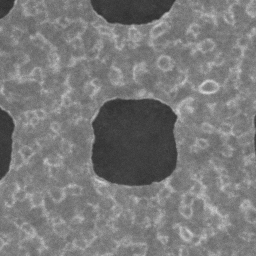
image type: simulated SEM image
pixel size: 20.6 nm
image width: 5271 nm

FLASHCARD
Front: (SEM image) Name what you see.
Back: holes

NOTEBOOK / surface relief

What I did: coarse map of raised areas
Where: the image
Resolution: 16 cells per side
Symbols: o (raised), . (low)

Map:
.ooooo.....ooooo
ooooooo..ooooooo
oooooooooooooooo
oooooooooooooooo
oooooooooooooooo
oooooooooooooooo
ooooooo...oooooo
.ooooo.....ooooo
.ooooo.....ooooo
.ooooo.....ooooo
.ooooo.....ooooo
ooooooo..ooooooo
oooooooooooooooo
oooooooooooooooo
oooooooooooooooo
oooooooooooooooo